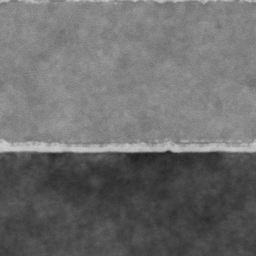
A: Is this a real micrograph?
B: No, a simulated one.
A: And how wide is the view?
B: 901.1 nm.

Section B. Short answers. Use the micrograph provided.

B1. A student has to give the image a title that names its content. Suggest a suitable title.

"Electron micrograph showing one or a few lines or trenches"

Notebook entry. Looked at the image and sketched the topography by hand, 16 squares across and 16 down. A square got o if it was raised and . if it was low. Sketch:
oooooooooooooooo
oooooooooooooooo
oooooooooooooooo
oooooooooooooooo
oooooooooooooooo
oooooooooooooooo
oooooooooooooooo
oooooooooooooooo
oooooooooooooooo
................
................
................
................
................
................
................